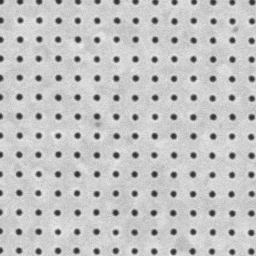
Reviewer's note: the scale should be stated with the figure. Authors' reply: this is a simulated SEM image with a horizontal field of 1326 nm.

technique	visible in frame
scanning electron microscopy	a regular array of holes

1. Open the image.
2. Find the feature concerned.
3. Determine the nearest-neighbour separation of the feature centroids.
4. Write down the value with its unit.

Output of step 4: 97.7 nm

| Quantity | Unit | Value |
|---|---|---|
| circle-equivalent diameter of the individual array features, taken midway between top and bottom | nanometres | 38.4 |